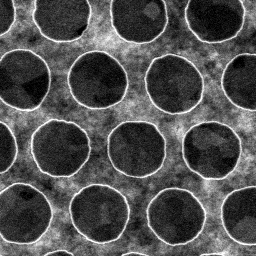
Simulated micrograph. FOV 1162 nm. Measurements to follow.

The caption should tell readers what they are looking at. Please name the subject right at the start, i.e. raised bodies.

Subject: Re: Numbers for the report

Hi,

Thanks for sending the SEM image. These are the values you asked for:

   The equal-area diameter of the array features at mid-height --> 265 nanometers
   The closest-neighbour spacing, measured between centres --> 339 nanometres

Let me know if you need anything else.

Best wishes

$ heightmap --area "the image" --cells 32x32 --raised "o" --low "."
oo..ooooooo...ooooooo..ooooooo..
oo..ooooooo...ooooooo..oooooooo.
oo..ooooooo...ooooooo..ooooooo..
o....oooooo...ooooooo...oooooo..
......oooo.....ooooo.....oooo...
................................
.ooo.......oo...................
ooooo.....ooooo....oooo......ooo
oooooo...oooooo....oooooo...oooo
oooooo...ooooooo..ooooooo...oooo
oooooo...ooooooo..ooooooo...oooo
oooooo...ooooooo..ooooooo...oooo
ooooo....oooooo....oooooo....ooo
..ooo......oo.......oooo......oo
................................
o....oooo......oooo......ooo....
o...ooooooo...oooooo...oooooo...
oo..ooooooo...ooooooo..ooooooo..
oo..ooooooo...ooooooo..ooooooo..
oo..ooooooo...ooooooo..ooooooo..
oo...ooooo....oooooo...ooooooo..
o....ooooo.....oooo.....ooooo...
................................
.ooo.......ooo................oo
oooooo...oooooo....ooooo....oooo
oooooo...ooooooo...oooooo...oooo
oooooo...ooooooo..oooooooo..oooo
oooooo...ooooooo..oooooooo..oooo
oooooo...ooooooo...oooooo...oooo
ooooo......oooo.....ooooo....ooo
.....................oo.......oo
.......o........................